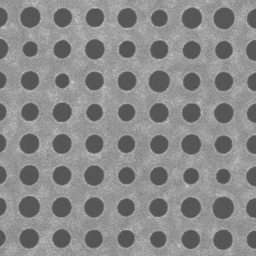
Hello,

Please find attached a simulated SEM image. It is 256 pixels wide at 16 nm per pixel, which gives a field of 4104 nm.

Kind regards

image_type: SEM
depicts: a regular array of holes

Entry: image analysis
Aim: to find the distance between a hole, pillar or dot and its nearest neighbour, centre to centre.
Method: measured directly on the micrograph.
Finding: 505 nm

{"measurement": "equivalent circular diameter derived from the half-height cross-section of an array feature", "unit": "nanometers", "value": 310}